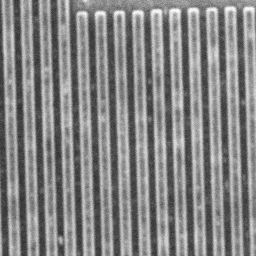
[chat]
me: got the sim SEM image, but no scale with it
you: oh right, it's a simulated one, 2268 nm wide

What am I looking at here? parallel lines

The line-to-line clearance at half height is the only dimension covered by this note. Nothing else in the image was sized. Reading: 89.7 nm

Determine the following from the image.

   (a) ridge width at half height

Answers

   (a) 75.3 nm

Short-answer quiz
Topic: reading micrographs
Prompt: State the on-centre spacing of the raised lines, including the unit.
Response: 164 nanometers